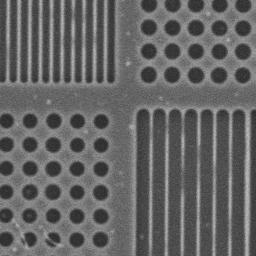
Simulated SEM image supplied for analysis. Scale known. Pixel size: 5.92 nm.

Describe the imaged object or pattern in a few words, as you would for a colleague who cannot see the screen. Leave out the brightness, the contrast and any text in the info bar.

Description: groups of lines, slits or small figures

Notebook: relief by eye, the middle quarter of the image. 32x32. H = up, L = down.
LLHLLLLHLLHLLHHHHHHHHHHHHHHHHHHH
LLHLLLLHLLHLLHHHHHHLLLLHHLLLLHHL
LLLLLLLHLLLLLHHHHHHLLLLHHLLLLHHL
LLLLLLLHLLLLLHHHHHHLLLLHHLLLLHHL
LLHLHLLHLLHLLHHHHHHHLLHHHHLLHHHH
HHHHHHHHHHHHHHHHHHHHHHHHHHHHHHHH
HHHHHHHHHHHHHHHHHHHHHHHHHHHHHHHH
HHHHHHHHHHHHHHHHHHHHHHHHHHHHHHHH
HHHHHHHHHHHHHHHHHHHHHHHHHHHHHHHH
HHHHHHHHHHHHHHHHHHHHHHHHHHHHHHHH
HHHHHHHHHHHHHHHHHHHHHHHHHHHHHHHH
HHHHHHHHHHHHHHHHHHHLLHHLLHHLLHHL
HHHLHHHHHLHHHHHHHHLLLLLLLLLLLLLL
HHLLLHHHLLLHHHHHHHLLLLLLLLLLLLLL
HLLLLHHLLLLHHHHHHHLLLLLLLLLLLLLL
HHLLLHHHLLLHHHHHHHLLLLLLLLLLLLLL
HHHHHHHHHHHHHHHHHHLLLLLLLLLLLLLL
HHHHHHHHHHHHHHHHHHLLLLLLLLLLLLLL
HHHLHHHHHLHHHHHHHHLLLLLLLLLLLLLL
HHLLLHHHLLLHHHHHHHLLLLLLLLLLLLLL
HLLLLHHLLLLHHHHHHHLLLLLLLLLLLLLL
HHLLLHHHLLLHHHHHHHLLLLLLLLLLLLLL
HHHHHHHHHHHHHHHHHHLLLLLLLLLLLLLL
HHHHHHHHHHHHHHHHHHLLLLLLLLLLLLLL
HHLLHHHHLLHHHHHHHHLLLLLLLLLLLLLL
HLLLLHHLLLLHHHHHHHLLLLLLLLLLLLLL
HLLLLHHLLLLHHHHHHHLLLLLLLLLLLLLL
HHLLLHHHLLLHHHHHHHLLLLLLLLLLLLLL
HHHHHHHHHHHHHHHHHHLLLLLLLLLLLLLL
HHHHHHHHHHHHHHHHHHLLLLLLLLLLLLLL
HHLLHHHHLLHHHHHHHHLLLLLLLLLLLLLL
HLLLLHHLLLLHHHHHHHLLLLLLLLLLLLLL